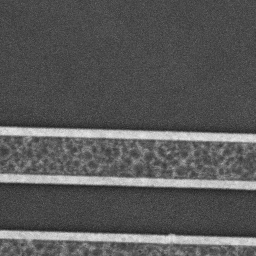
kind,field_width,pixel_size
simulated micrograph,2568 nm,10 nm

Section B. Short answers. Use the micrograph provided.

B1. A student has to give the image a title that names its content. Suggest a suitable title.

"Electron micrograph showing one or a few lines or trenches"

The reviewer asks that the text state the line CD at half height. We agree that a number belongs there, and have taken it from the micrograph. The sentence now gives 456 nanometres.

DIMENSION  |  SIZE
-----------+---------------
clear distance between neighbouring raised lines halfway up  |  57.3 px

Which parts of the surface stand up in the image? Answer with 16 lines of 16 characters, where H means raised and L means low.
LLLLLLLLLLLLLLLL
LLLLLLLLLLLLLLLL
LLLLLLLLLLLLLLLL
LLLLLLLLLLLLLLLL
LLLLLLLLLLLLLLLL
LLLLLLLLLLLLLLLL
LLLLLLLLLLLLLLLL
LLLLLLLLLLLLLLLL
HHHHHHHHHLLLLLLL
HHHHHHHHHHHHHHHH
HHHHHHHHHHHHHHHH
LLLLLLLLLLLLLLLH
LLLLLLLLLLLLLLLL
LLLLLLLLLLLLLLLL
LLLLLLLLLLLLLLLL
HHHHHHHHHHHHHHHH